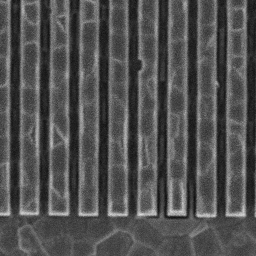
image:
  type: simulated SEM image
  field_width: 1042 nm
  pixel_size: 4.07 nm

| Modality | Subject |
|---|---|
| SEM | parallel lines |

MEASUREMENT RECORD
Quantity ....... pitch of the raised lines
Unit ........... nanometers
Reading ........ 120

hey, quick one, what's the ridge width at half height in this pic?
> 0.0747 um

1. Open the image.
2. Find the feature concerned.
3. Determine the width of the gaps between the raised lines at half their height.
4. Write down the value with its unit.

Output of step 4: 44.7 nanometres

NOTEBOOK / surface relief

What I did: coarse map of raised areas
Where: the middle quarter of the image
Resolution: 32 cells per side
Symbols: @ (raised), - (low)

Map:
@---@@@@---@@@@@----@@@---@@@@@-
@---@@@@---@@@@@---@@@@---@@@@@-
@---@@@@@--@@@@@---@@@@---@@@@@-
@---@@@@@--@@@@@---@@@@---@@@@@-
@---@@@@---@@@@@---@@@@---@@@@@-
@---@@@@---@@@@@---@@@@---@@@@@-
@---@@@@@--@@@@@---@@@@---@@@@@-
@---@@@@@--@@@@@---@@@@---@@@@@-
@---@@@@@--@@@@@---@@@@---@@@@@-
@---@@@@@--@@@@@---@@@@---@@@@@-
@---@@@@@--@@@@@---@@@@---@@@@@-
@---@@@@@--@@@@@---@@@@---@@@@@-
@---@@@@@--@@@@@---@@@@---@@@@@-
@---@@@@@--@@@@@---@@@@---@@@@@-
@---@@@@@--@@@@@---@@@@---@@@@@-
@---@@@@@--@@@@@---@@@@---@@@@@-
@---@@@@@--@@@@@---@@@@---@@@@@-
@---@@@@@--@@@@@---@@@@---@@@@@-
@---@@@@@--@@@@@---@@@@---@@@@@-
@---@@@@@--@@@@@---@@@@---@@@@@-
@---@@@@@--@@@@@---@@@@---@@@@@-
@---@@@@@--@@@@@---@@@@---@@@@@-
@---@@@@@--@@@@@---@@@@---@@@@@-
@---@@@@---@@@@@---@@@@---@@@@@-
@---@@@@---@@@@@---@@@@---@@@@@-
@---@@@@---@@@@@---@@@@---@@@@@-
@---@@@@---@@@@@---@@@@---@@@@@-
@---@@@@---@@@@@---@@@@---@@@@@-
@---@@@@---@@@@@---@@@@---@@@@@-
@---@@@@---@@@@@---@@@@---@@@@--
@---@@@@---@@@@@---@@@@---@@@@@-
@---@@@@---@@@@@---@@@@---@@@@@-